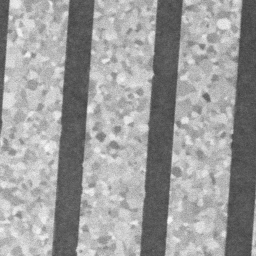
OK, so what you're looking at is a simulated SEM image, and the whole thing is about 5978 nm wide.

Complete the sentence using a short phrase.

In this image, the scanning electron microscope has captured one or a few lines or trenches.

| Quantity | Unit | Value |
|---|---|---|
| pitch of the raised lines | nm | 2020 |